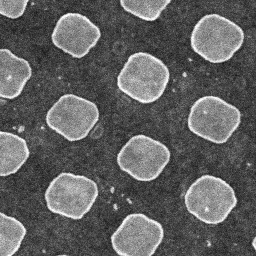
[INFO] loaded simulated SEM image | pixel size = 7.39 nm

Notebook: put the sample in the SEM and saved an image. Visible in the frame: a regular array of raised bodies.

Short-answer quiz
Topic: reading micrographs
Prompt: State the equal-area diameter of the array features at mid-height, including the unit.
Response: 348 nm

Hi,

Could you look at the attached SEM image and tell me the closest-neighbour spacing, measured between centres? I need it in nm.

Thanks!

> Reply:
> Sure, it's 587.